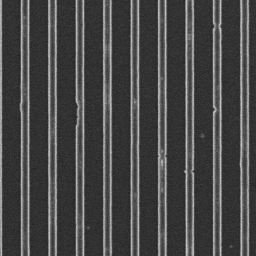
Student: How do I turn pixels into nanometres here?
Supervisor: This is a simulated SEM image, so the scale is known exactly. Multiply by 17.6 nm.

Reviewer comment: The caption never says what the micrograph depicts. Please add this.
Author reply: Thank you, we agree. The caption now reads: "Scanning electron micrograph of parallel lines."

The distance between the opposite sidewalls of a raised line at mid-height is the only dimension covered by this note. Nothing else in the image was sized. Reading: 0.124 microns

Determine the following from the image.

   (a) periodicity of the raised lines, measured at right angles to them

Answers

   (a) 483 nm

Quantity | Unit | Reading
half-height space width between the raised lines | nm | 356